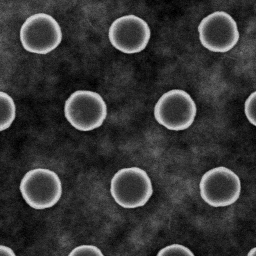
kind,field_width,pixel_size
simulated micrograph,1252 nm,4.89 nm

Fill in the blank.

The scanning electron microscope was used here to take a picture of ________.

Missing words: a regular array of raised bodies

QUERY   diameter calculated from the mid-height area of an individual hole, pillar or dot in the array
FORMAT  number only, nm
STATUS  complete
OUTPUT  190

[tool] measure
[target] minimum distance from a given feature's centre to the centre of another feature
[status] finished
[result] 432 nm